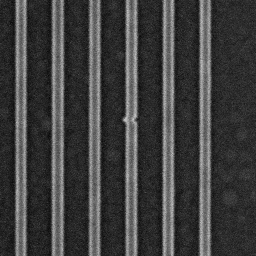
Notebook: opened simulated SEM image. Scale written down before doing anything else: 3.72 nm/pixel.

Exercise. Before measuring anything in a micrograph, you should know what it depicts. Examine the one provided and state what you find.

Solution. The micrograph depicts parallel lines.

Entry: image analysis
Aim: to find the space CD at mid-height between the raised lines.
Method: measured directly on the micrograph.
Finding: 103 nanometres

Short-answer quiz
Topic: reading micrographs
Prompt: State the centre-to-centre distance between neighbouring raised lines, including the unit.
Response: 137 nm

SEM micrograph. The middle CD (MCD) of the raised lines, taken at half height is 34.4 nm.